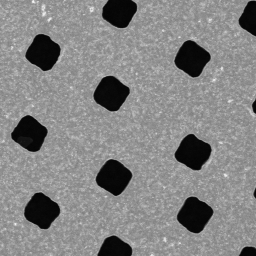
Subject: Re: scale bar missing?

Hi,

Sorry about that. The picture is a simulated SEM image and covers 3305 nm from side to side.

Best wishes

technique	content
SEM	a regular array of holes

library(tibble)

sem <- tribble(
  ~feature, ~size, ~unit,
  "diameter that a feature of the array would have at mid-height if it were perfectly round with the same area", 432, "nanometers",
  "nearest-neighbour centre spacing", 1020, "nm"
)